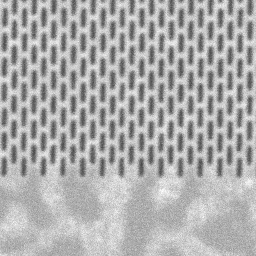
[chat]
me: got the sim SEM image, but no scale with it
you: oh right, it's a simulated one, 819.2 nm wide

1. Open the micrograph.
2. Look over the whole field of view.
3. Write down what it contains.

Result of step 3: a regular array of holes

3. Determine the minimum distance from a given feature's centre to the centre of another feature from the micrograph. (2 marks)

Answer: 0.0496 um